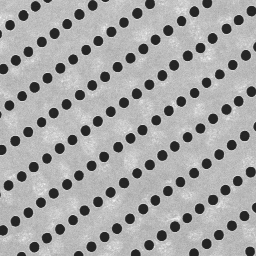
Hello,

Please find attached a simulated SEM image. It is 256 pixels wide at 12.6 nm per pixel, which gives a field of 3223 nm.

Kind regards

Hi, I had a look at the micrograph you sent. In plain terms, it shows a regular array of holes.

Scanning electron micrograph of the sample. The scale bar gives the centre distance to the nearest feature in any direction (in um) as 0.195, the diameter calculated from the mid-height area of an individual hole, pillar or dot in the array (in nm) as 130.